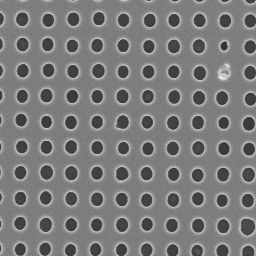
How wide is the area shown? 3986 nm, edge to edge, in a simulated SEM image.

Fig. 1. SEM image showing a regular array of holes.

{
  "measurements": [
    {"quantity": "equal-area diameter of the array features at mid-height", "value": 198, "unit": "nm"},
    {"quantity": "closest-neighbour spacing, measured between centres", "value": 383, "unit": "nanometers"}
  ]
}